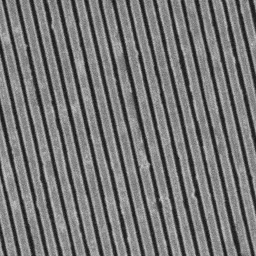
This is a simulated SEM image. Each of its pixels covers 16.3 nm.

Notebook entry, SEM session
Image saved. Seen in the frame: parallel lines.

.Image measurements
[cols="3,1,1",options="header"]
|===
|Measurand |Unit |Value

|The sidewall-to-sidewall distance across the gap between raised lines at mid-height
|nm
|97.4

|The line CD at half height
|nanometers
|127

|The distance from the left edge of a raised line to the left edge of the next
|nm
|219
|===